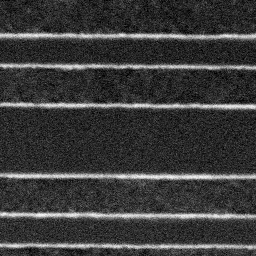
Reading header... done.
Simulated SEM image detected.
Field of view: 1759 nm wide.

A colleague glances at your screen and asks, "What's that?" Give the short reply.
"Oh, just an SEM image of lines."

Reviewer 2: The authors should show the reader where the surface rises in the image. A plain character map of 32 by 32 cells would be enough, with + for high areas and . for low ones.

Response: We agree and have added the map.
................................
................................
................................
................................
+++++++++++++++++++++++....++..+
++++++++++++++++++++++++++++++++
++++++++++++++++++++++++++++++++
++++++++++++++++++++++++++++++++
..........................++.+++
................................
................................
................................
................................
++++++++++++++++++++++++++++++++
++++++++++++++++++++++++++++++++
++++++++++++++++++++++++++++++++
++++++++++++++++++++++++++++++++
++++++++++++++++++++++++++++++++
++++++++++++++++++++++++++++++++
++++++++++++++++++++++++++++++++
++++++++++++++++++++++++++++++++
++++++++++++++++++++++++++++++++
................................
................................
................................
................................
................................
++++++++++++++++++++++++++++++++
++++++++++++++++++++++++++++++++
++++++++++++++++++++++++++++++++
++++++++++++++++++++++++++++++++
................................